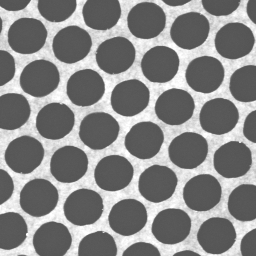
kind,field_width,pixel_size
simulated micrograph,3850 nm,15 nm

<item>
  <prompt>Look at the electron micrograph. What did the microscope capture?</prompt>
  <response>a regular array of holes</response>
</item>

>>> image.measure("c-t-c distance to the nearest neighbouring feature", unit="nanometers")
672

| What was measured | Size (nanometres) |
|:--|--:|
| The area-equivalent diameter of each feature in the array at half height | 574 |